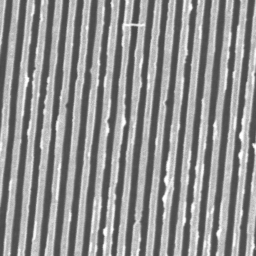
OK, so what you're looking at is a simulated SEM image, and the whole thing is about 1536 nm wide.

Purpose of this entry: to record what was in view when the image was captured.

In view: parallel lines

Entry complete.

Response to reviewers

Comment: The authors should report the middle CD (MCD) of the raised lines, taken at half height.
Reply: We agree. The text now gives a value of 44.8 nm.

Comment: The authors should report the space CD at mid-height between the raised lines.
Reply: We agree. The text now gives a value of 38.8 nanometers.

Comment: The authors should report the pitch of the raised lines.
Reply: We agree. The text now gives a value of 85.1 nanometres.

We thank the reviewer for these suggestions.